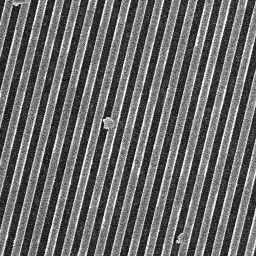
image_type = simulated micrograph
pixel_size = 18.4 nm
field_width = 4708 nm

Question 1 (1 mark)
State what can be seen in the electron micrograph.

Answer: parallel lines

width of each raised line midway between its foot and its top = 141 nanometres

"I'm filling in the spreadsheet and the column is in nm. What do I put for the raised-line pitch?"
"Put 298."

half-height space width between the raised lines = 154 nanometers